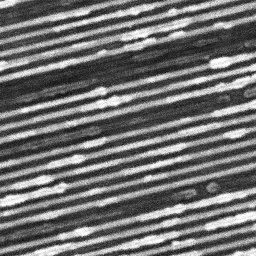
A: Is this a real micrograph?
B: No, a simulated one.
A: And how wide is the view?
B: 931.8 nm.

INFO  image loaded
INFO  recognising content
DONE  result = parallel lines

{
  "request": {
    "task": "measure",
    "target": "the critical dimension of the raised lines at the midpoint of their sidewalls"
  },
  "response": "14.2 nanometers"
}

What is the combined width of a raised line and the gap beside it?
43.6 nm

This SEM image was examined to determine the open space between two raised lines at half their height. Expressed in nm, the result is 27.9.